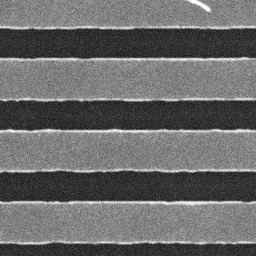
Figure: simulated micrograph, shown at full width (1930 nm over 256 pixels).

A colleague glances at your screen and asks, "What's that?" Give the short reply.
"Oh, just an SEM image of lines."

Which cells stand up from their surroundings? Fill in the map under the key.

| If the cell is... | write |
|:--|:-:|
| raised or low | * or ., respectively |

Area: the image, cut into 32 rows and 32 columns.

********************************
********************************
********************************
.*********..*****........****...
................................
................................
................................
********************************
********************************
********************************
********************************
********************************
*.*.****..**...****.***.........
................................
................................
................................
********************************
********************************
********************************
********************************
********************************
................................
................................
................................
................................
********************************
********************************
********************************
********************************
********************************
................................
................................